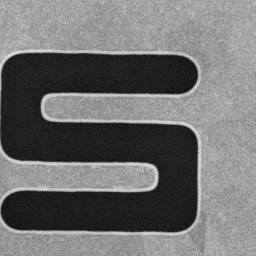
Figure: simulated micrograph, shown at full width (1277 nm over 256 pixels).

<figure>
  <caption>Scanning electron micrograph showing groups of lines, slits or small figures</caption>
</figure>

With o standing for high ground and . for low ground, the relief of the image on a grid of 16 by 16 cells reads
oooooooooooooooo
oooooooooooooooo
oooooooooooooooo
o...........oooo
............oooo
............oooo
...ooooooooooooo
...ooooooooooooo
............oooo
............oooo
oooooooooo..oooo
oooooooooo..oooo
............oooo
............oooo
ooo........ooooo
oooooooooooooooo